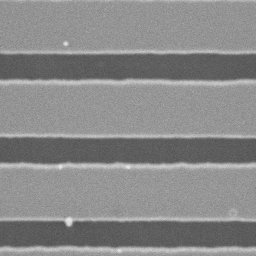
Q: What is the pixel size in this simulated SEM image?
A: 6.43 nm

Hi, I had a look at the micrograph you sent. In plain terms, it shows lines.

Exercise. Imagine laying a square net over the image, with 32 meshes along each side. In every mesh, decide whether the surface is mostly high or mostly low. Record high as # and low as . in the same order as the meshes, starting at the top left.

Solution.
################################
################################
################################
################################
################################
################################
################################
................................
................................
................................
################################
################################
################################
################################
################################
################################
################################
................................
................................
................................
####...######.##......##.##.#.##
################################
################################
################################
################################
################################
################################
################################
................................
................................
................................
################################